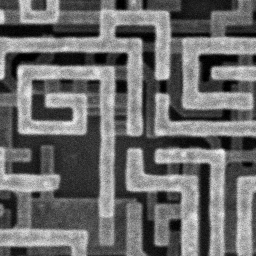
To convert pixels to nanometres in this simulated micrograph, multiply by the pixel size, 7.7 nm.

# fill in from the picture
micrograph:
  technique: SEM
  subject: wiring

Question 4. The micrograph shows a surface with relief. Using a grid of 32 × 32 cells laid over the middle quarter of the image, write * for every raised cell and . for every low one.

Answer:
...............****....***....**
*******************....***....**
*******************....***....**
*******************....***....**
..****...****...***...........**
..****...****...***...........**
..****...****...***...........**
..*****..****...***...........**
*******************....***....**
*******************....***....**
*******************....***....**
..***....***....***....***......
...**....***....***....***......
...***...***....***....***......
******...**********....*********
******...**********....*********
******...**********....*********
.........****...***....****....*
..........***...................
..........***...................
.........***....................
.........***....***....*********
.........***....***....*********
.........***....***....*********
.........***....****...***...***
.........***....****..........**
.........***....****..........**
.........***....****..........**
.........***....****************
.........***....****************
.........***....****************
.........***....****************